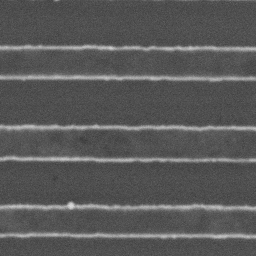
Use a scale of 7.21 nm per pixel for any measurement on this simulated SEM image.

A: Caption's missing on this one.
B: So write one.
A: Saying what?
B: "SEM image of lines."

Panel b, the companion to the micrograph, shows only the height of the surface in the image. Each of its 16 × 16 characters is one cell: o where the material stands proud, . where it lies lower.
................
................
................
oooooooooooooooo
oooooooooooooooo
................
................
................
oooooooooooooooo
oooooooooooooooo
................
................
................
oooooooooooooooo
oooooooooooooooo
................